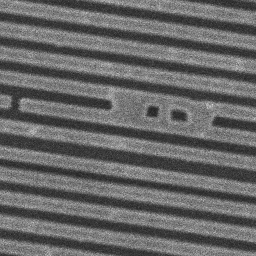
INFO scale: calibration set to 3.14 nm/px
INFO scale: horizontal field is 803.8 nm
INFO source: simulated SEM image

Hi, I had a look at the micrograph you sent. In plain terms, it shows parallel lines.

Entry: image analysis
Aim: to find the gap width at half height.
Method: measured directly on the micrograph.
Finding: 11.2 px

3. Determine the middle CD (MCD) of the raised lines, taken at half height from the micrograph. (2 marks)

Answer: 38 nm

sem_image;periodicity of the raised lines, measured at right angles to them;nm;74.9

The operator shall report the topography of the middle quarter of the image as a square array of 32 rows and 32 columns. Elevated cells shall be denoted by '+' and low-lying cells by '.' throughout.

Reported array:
++++++++++++++++................
..+++++++++++++++++++++.........
.........+++++++++++++++++++++..
.................+++++++++++++++
++++....................++++++++
++++++++++...................+++
+++++++++++++++++...............
...+++++++++++++++++++++........
.........+++++++++++++++++++++..
............++++++++++++++++++++
+++.........+++++++++..+++++++++
++++++++++.++++++++++...+++..+++
+++++++++++++++++++++...+++....+
+++++++++++++++++++++++++++....+
.......+++++++++++++++++++++++++
..............++++++++++++++++++
++..................+.++++++++++
+++++++++....................+++
+++++++++++++++.................
...+++++++++++++++++++..........
.........++++++++++++++++++++...
................++++++++++++++++
.......................+++++++++
++++........................++++
++++++++++......................
+++++++++++++++++...............
....++++++++++++++++++++........
...........+++++++++++++++++++..
++...............+++++++++++++++
+++++++++...............++++++++
+++++++++++++++................+
.+++++++++++++++++++++..........